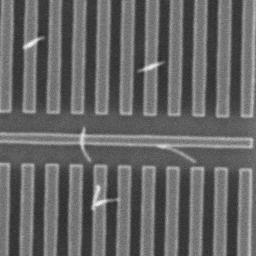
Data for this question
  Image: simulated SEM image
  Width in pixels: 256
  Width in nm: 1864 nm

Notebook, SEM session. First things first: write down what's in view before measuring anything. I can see groups of lines, slits or small figures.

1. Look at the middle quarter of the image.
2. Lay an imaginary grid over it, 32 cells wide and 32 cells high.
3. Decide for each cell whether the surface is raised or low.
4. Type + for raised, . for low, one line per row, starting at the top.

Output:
..+++...+++...+++....++...+++...
..+++...+++...+++...+++...+++...
..+++...+++...+++...+++...+++...
..+++...+++...+++...+++...+++...
..+++...+++...+++...+++...+++...
..+++...+++...+++...+++...+++...
..+++...+++...+++...+++...+++...
..+++...+++...+++...+++...+++...
..+++...+++...+++...+++...+++...
..+++...+++...+++...+++...+++...
..+++...+++...+++...+++...+++...
..+++...+++...+++...+++...+++...
....................+++...+++...
................................
................................
................................
................................
....+...........................
++++++++++++++++++++++++++++++++
++++++++++++++++++++++++++++++++
.......................++.......
................................
................................
................................
................................
..++............................
..++....++....+++...+++...+++...
..++....++....+++...+++...+++...
..++....++....+++...+++...+++...
..++....++....+++...+++...+++...
..++....++....+++...+++...+++...
..++....++....+++...++....++....